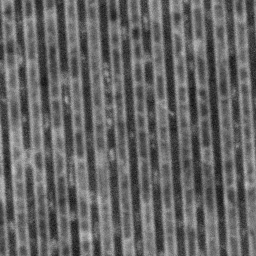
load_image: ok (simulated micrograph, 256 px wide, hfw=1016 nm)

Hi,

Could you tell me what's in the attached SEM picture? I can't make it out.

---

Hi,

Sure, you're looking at parallel lines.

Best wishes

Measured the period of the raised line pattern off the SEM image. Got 83.5 nm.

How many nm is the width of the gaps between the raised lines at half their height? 42.1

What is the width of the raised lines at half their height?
38.6 nm